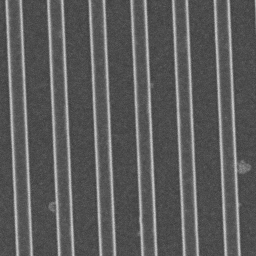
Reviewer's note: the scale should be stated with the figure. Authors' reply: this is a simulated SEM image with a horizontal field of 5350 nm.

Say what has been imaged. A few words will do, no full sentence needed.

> parallel lines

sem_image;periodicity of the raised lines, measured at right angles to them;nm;869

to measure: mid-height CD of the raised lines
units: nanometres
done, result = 292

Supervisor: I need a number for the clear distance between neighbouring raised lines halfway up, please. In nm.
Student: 566